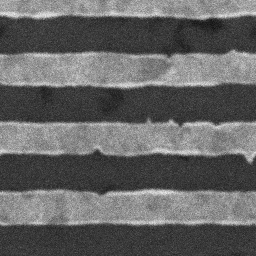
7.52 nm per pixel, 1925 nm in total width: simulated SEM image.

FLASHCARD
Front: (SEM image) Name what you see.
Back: one or a few lines or trenches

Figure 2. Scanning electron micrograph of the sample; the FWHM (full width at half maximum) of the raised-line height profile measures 222 nm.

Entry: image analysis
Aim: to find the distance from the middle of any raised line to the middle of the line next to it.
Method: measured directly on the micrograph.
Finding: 69.1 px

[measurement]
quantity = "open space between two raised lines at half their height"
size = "0.3 microns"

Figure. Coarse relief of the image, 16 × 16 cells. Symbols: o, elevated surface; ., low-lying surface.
oooooooooooooooo
................
................
oooooooooo.ooooo
oooooooooooooooo
................
................
................
oooooooooooooooo
.ooooooooo.ooooo
................
................
oooooooooooooooo
oooooooooooooooo
................
................